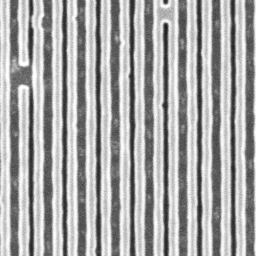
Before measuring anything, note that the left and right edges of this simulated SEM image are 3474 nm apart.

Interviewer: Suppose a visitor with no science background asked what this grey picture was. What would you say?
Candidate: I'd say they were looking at parallel lines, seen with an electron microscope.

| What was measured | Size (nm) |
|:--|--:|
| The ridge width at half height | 115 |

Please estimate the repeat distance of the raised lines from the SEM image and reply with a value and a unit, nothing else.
227 nm